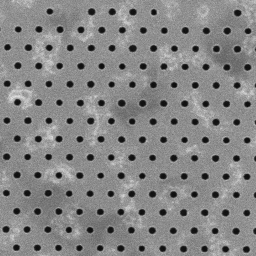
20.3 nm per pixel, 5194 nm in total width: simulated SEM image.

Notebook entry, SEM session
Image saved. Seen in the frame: a regular array of holes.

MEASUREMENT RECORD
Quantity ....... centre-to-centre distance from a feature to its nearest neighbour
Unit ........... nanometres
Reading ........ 418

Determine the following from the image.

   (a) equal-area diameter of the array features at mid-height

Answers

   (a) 141 nanometres